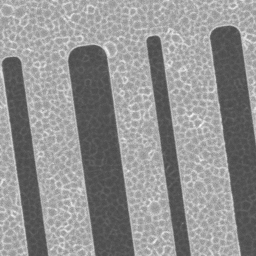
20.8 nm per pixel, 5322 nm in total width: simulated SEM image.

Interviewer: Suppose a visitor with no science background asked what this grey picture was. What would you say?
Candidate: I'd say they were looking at one or a few lines or trenches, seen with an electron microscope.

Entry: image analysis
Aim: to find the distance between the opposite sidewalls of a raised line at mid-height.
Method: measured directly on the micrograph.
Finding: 947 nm